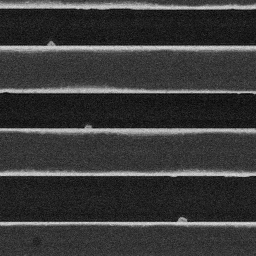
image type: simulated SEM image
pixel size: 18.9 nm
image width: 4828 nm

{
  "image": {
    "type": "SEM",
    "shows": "lines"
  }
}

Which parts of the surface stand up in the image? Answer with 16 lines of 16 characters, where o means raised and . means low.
...........oo...
................
................
oooooooooooooooo
oooooooooooooooo
oooooooooooooooo
................
................
oooooooooooooooo
oooooooooooooooo
oooooooooooooooo
................
................
................
oooooooooooooooo
oooooooooooooooo